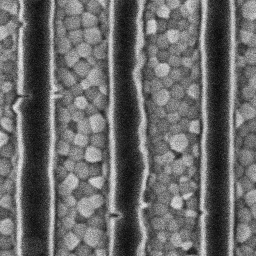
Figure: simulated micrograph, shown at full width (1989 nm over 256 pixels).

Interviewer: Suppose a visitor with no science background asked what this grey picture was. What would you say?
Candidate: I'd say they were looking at one or a few lines or trenches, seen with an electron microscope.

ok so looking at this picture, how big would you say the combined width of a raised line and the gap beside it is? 707 nm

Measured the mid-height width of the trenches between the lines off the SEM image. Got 58.5 px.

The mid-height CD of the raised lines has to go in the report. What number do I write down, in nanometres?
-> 245